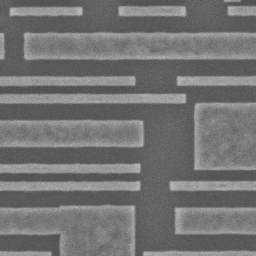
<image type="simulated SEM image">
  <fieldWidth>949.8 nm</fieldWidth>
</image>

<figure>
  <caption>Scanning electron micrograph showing wiring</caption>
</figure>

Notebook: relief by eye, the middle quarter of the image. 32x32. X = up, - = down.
--------------------------------
--------------------------------
--------------------------------
XXX--XXXXXXXXXXXXX----------XXXX
XXXXXXXXXXXXXXXXXX----------XXXX
--------------------------------
--------------------------------
--------------------------------
XXXXXXXXXXXXXXXXXXXXXXXXXXXXXX--
XXXXXXXXXXXXXXXXXXXXXXXXXXXXXX--
--------------------------------
--------------------------------
--------------------------------
--------------------------------
XXXXXXXXXXXXXXXXXXXX------------
XXXXXXXXXXXXXXXXXXXX------------
XXXXXXXXXXXXXXXXXXXX------------
XXXXXXXXXXXXXXXXXXXX------------
XXXXXXXXXXXXXXXXXXXX------------
XXXXXXXXXXXXXXXXXXXX------------
XXXXX---X-XX-XXXXXX-------------
--------------------------------
--------------------------------
--------------------------------
--------------------------------
XXXXXXXXXXXXXXXXXXX-------------
XXXXXXXXXXXXXXXXXXX-------------
--------------------------------
--------------------------------
-XX-XX---XXXXXXX--X--------XXXXX
XXXXXXXXXXXXXXXXXXX--------XXXXX
XX-----XX-------XXX-----------XX